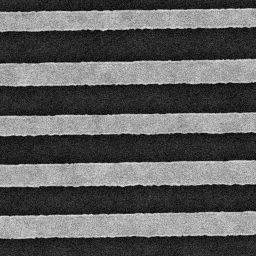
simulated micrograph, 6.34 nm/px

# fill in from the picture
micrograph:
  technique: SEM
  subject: lines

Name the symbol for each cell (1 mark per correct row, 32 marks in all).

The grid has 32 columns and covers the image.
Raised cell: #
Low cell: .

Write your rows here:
................................
.....###########################
################################
######################..........
................................
................................
................................
..............................##
################################
################################
################................
................................
................................
................................
.......#########################
################################
################################
................................
................................
................................
.........#######################
################################
################################
................................
................................
................................
..............................##
################################
################################
################.###.#..........
................................
................................